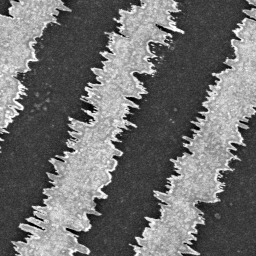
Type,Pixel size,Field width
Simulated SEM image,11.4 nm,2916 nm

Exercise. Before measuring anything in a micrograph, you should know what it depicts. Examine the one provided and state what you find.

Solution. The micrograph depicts one or a few lines or trenches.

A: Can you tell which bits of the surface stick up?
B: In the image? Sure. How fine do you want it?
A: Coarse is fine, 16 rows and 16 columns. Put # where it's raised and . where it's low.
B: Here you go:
.###....###.....
###.....###....#
##.....###.....#
##.....##......#
#.....###.....##
#.....###....###
#.....##.....###
#.....##....###.
.....##.....###.
....###.....##..
...####....###..
...####....###..
...###....###...
..####....###...
..###....###....
.####....###....